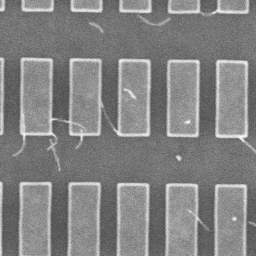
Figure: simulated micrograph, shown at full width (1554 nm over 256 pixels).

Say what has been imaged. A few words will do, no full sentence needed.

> groups of lines, slits or small figures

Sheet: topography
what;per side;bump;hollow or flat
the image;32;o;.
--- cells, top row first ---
...oooo..oooo..oooo..oooo..oooo.
.....................ooo....ooo.
................................
................................
................................
................................
................................
...ooo...ooo....................
...ooo...oooo..oooo..oooo..oooo.
...ooo...oooo..oooo..oooo..oooo.
...ooo...oooo..oooo..oooo..oooo.
...ooo...oooo..oooo..oooo..oooo.
...ooo...ooo...oooo..oooo..oooo.
...ooo...ooo...oooo..oooo..oooo.
...ooo...ooo...oooo..oooo..oooo.
...ooo...ooo...oooo..oooo..oooo.
...ooo...ooo...oooo..oooo..oooo.
................................
................................
................................
................................
................................
................................
...ooo...ooo...ooo...oooo..oooo.
...ooo...ooo...ooo...oooo..oooo.
...ooo...ooo...ooo...oooo..oooo.
...ooo...ooo...ooo...oooo..oooo.
...ooo...ooo...ooo...oooo..oooo.
...ooo...ooo...ooo...ooo...oooo.
...ooo...ooo...ooo...ooo...oooo.
...ooo...ooo...ooo...ooo...oooo.
...ooo...ooo...ooo...ooo...oooo.